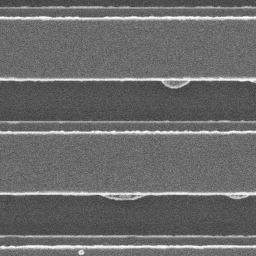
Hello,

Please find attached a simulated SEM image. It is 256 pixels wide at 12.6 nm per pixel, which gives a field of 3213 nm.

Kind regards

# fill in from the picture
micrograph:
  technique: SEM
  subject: lines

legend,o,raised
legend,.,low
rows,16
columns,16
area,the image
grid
oooooooooooooooo
oooooooooooooooo
oooooooooooooooo
oooooooooooooooo
oooooooooooooooo
................
................
................
oooooooooooooooo
oooooooooooooooo
oooooooooooooooo
oooooooooooooooo
................
................
................
oooooooooooooooo